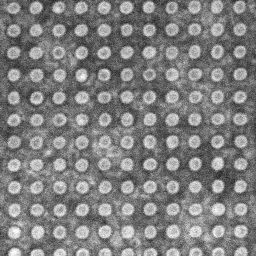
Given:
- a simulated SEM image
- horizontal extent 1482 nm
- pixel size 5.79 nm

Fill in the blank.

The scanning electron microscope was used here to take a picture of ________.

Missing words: a regular array of raised bodies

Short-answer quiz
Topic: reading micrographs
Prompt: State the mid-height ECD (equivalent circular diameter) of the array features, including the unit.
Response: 68.2 nm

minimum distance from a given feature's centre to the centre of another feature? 128 nanometres